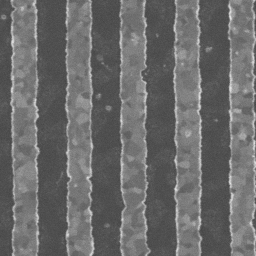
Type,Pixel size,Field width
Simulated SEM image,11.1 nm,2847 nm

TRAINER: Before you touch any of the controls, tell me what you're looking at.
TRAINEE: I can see parallel lines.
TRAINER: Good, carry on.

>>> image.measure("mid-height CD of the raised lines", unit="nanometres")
274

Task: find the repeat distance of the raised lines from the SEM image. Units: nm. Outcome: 605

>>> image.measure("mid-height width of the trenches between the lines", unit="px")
30.3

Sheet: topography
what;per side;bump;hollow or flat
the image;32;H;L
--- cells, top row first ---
LLHHLLLLHHHLLLLHHHLLLLHHHLLLLHHH
LLHHHLLLHHHLLLLHHHLLLLHHHLLLLHHH
LLHHHLLLHHHLLLLHHHLLLLHHHLLLLHHH
LHHHLLLLHHHLLLLHHHLLLLHHHLLLLHHH
LLHHHLLLHHHLLLLHHHLLLLHHHLLLLHHH
LLHHHLLLHHHLLLLHHHLLLLHHHLLLLHHH
LLHHHLLLHHHLLLLHHHLLLLHHHLLLLHHH
LLHHHLLLHHHLLLLHHHLLLLHHHLLLLHHH
LLHHHLLLHHHLLLLHHHLLLLHHHLLLLHHH
LHHHHLLLHHHLLLLHHHLLLLHHHLLLLHHH
LLHHHLLLHHHLLLLHHHLLLLHHHLLLLHHH
LHHHHLLLHHHHLLLHHHLLLLHHHLLLLHHH
LHHHLLLLHHHLLLLHHHLLLLHHHLLLLHHH
LHHHHLLLHHHLLLLHHHLLLLHHHLLLLHHH
LHHHHLLLHHHLLLLHHHLLLLHHHLLLLHHH
LHHHLLLLHHHLLLLHHHLLLLHHHLLLLHHH
LHHHHLLLHHHLLLLHHHLLLLHHHLLLLHHH
LHHHHLLLHHHLLLLHHHLLLLHHHLLLLHHH
LHHHHLLLHHHHLLLHHHLLLLHHHLLLLHHH
LLHHHLLLHHHLLLLHHHLLLLHHHLLLLHHH
LLHHHLLLHHHLLLLHHHLLLLHHHLLLLHHH
LLHHHLLLHHHLLLLHHHLLLLHHHLLLLHHH
LLHHHLLLLHHLLLLHHHLLLLHHHLLLLHHH
LLHHHLLLLHHLLLLHHHLLLLHHHLLLLHHH
LLHHHLLLLHHLLLLHHHLLLLHHHLLLLHHH
LLHHHLLLLHHLLLLLHHLLLLHHHLLLLHHH
LLHHHLLLHHHLLLLHHHLLLLHHHLLLLHHH
LLHHHLLLHHHLLLLHHHLLLLHHHLLLLHHH
LLHHHLLLLHHLLLLHHHLLLLHHHLLLLHHH
LLHHHLLLHHHHLLLHHHLLLLHHHLLLLHHH
LLHHHLLLHHHHLLLHHHLLLLHHHLLLLHHH
LLHHHLLLHHHHLLLHHHHLLLHHHLLLLHHH